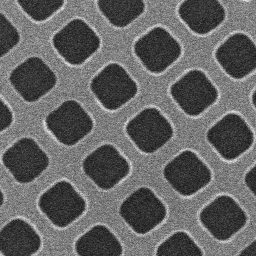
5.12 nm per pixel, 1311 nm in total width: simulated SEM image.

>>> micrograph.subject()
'a regular array of holes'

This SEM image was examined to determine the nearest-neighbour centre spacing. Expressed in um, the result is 0.291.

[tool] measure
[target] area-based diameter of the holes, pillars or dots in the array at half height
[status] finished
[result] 0.226 µm